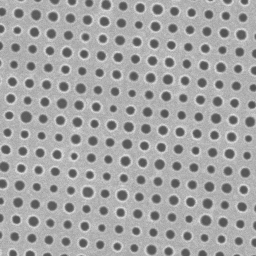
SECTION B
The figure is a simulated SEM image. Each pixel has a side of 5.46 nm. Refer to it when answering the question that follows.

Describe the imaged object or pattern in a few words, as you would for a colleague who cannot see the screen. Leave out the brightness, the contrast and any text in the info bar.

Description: a regular array of holes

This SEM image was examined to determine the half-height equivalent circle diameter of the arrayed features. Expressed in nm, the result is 48.9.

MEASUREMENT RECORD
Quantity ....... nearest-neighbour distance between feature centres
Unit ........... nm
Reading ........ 92.4